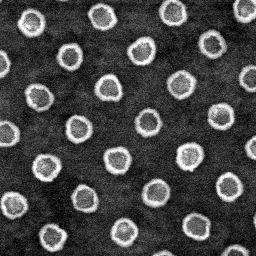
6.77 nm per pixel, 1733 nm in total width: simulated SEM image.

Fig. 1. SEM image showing a regular array of raised bodies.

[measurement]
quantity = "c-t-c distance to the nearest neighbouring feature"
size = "0.337 um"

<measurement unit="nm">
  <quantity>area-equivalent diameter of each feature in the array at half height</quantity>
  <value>169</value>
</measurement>